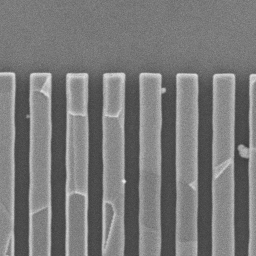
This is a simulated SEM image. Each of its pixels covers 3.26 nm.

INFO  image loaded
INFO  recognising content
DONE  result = groups of lines, slits or small figures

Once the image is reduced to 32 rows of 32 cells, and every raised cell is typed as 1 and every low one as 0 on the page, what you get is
00000000000000000000000000000000
00000000000000000000000000000000
00000000000000000000000000000000
00000000000000000000000000000000
00000000000000000000000000000000
00000000000000000000000000000000
00000000000000000000000000000000
00000000000000000000000000000000
00000000000000000000000000000000
11001100111001100011001110011001
11001100111001110111001110011001
11001100111001100111001110011001
11001100111001100111001110011001
11001100111001100011001110011001
11001100111001100111001110011001
11001100111001100111001110011001
11001100111001100111001110011001
11001100111001100111001110011001
11001100111001100111001110011001
11001100111001100111001110011001
11001100111001100111001110011001
11001100111001100111001110011001
11001100111001110111001110011001
11001100111001100111001110011001
11001100111001100111001110011001
11001100111001100111001110011001
11001100111001100111001110011001
11001100111001100111001110011001
11001100111001100111001110011001
11001100111001100111001110011001
11001100111001100111001110011001
11001100111001100111001110011001